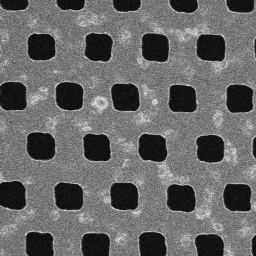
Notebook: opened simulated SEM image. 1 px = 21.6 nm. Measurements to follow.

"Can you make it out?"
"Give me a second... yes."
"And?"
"a regular array of holes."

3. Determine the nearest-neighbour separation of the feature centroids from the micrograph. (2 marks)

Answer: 1200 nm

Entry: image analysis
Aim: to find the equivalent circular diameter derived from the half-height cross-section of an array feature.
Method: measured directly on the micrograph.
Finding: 0.639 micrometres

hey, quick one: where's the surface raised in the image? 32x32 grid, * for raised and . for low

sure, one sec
...****....***....***....***....
***************.*******.*****..*
********************************
********************************
****..*****...****..*****...****
***....****...****...****...****
****...****...****...****...****
*****.*****...*****..****...****
********************************
********************************
...****...*****.****************
...****...****...****...****....
...****...****...****....***....
...*****..****...****....***....
********************************
********************************
********************************
***....***....***....****...****
***....***....***....****...****
****...****...***....****...****
********************************
********************************
********************************
...****...****...****...****...*
...****...****...****...****...*
...****...****...****...****...*
********************************
********************************
********************************
***...****...*****..*****..*****
***....***....***....***....***.
***....***....***....****...****